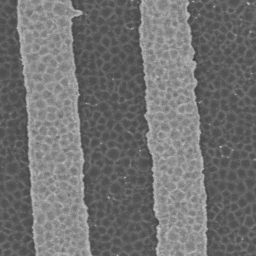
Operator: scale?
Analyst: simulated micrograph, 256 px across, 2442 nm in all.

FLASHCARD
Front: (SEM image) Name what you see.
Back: one or a few lines or trenches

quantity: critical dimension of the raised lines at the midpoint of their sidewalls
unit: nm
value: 478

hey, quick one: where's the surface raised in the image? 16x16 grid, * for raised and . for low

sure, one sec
.****....***....
.***.....***....
.***.....***....
.****....***....
..***....***....
..***....***....
..***....***....
..***....***....
..***....***....
..***....***....
..***.....***...
..***.....***...
..***.....***...
..***.....***...
..***.....***...
..****....***...